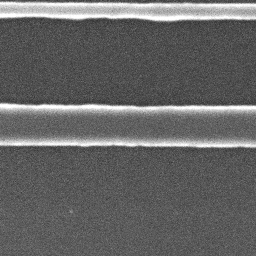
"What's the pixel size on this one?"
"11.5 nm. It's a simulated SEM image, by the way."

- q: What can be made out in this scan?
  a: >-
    lines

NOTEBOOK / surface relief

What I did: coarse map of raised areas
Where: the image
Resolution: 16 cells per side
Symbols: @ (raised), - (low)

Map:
@@@@@@@@@@@@@@@@
----------------
----------------
----------------
----------------
----------------
----------------
@@@@@@@@@@@@@@@@
@@@@@@@@@@@@@@@@
----------------
----------------
----------------
----------------
----------------
----------------
----------------